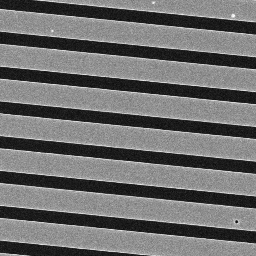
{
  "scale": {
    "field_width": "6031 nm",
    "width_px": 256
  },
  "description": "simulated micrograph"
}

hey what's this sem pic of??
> parallel lines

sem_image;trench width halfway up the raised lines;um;0.296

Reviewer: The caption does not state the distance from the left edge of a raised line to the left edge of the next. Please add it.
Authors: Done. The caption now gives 34.7 px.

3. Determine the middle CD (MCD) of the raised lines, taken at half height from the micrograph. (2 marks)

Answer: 516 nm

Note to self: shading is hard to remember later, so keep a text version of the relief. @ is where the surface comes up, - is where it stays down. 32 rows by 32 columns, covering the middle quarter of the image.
@@@@@@@@@@@@@@@@@@@@@@@@@@@@@@@@
@@@@@@@@@@@@@@@@@@@@@@@@@@@@@@@@
-----@@@@@@@@@@@@@@@@@@@@@@@@@@@
--------------@@@@@@@@@@@@@@@@@@
------------------------@@@@@@@@
@-------------------------------
@@@@@@@@@@@---------------------
@@@@@@@@@@@@@@@@@@@@@-----------
@@@@@@@@@@@@@@@@@@@@@@@@@@@@@@@-
@@@@@@@@@@@@@@@@@@@@@@@@@@@@@@@@
@@@@@@@@@@@@@@@@@@@@@@@@@@@@@@@@
-------@@@@@@@@@@@@@@@@@@@@@@@@@
-----------------@@@@@@@@@@@@@@@
---------------------------@@@@@
@@@-----------------------------
@@@@@@@@@@@@@-------------------
@@@@@@@@@@@@@@@@@@@@@@@@@-------
@@@@@@@@@@@@@@@@@@@@@@@@@@@@@@@@
@@@@@@@@@@@@@@@@@@@@@@@@@@@@@@@@
@@@@@@@@@@@@@@@@@@@@@@@@@@@@@@@@
----------@@@@@@@@@@@@@@@@@@@@@@
--------------------@@@@@@@@@@@@
------------------------------@@
@@@@@@@-------------------------
@@@@@@@@@@@@@@@@@---------------
@@@@@@@@@@@@@@@@@@@@@@@@@@@-----
@@@@@@@@@@@@@@@@@@@@@@@@@@@@@@@@
@@@@@@@@@@@@@@@@@@@@@@@@@@@@@@@@
---@@@@@@@@@@@@@@@@@@@@@@@@@@@@@
-------------@@@@@@@@@@@@@@@@@@@
-----------------------@@@@@@@@@
--------------------------------